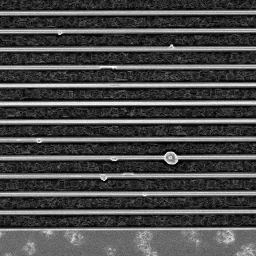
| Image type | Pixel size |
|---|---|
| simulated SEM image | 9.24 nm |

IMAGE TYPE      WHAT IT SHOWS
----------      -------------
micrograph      parallel lines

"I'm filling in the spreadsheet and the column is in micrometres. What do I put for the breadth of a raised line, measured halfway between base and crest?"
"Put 0.0323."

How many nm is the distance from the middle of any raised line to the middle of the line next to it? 167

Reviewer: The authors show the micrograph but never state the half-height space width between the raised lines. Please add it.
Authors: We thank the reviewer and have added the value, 134 nm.